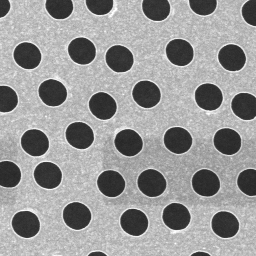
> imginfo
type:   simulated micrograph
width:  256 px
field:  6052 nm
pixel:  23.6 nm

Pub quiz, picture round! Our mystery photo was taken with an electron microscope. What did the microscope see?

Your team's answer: a regular array of holes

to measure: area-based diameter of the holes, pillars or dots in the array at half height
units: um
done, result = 0.659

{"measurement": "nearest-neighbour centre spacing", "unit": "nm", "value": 1060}